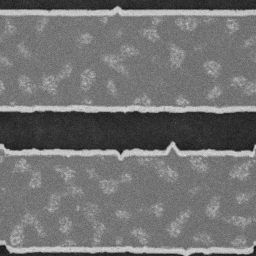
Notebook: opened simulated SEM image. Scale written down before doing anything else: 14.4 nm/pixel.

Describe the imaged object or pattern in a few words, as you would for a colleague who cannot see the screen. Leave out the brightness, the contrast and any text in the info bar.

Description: one or a few lines or trenches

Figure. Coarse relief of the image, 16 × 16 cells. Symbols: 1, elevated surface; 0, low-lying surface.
0000000000000000
1111111111111111
1111111111111111
1111111111111111
1111111111111111
1111111111111111
1111111111111111
0000000000000000
0000000000000000
1010000000100000
1111111111111111
1111111111111111
1111111111111111
1111111111111111
1111111111111111
0111111111111111